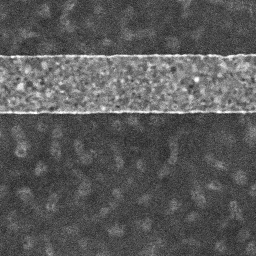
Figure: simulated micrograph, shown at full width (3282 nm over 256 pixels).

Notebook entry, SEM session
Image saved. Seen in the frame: one or a few lines or trenches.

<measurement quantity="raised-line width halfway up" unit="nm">734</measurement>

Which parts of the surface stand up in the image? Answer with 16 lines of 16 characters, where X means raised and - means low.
----------------
----------------
----------------
---XX--XXXXXXXXX
XXXXXXXXXXXXXXXX
XXXXXXXXXXXXXXXX
XXXXXXXXXXXXXXXX
----------------
----------------
----------------
----------------
----------------
----------------
----------------
----------------
----------------